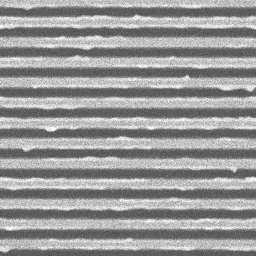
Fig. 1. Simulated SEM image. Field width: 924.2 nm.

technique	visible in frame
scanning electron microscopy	parallel lines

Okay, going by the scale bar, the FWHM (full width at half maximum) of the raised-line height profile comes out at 39.7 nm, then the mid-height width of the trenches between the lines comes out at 0.0334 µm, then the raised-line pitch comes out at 0.073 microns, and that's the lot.